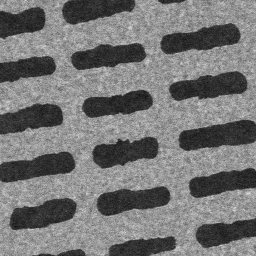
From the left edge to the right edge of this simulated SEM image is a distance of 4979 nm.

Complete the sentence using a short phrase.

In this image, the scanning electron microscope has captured holes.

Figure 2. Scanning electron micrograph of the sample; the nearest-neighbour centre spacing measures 942 nm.